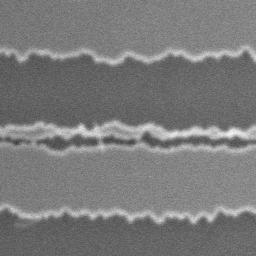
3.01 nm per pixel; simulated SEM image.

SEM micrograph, lines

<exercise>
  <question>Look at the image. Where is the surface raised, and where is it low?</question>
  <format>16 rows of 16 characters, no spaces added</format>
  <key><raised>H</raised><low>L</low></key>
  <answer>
HHHHHHHHHHHHHHHH
HHHHHHHHHHHHHHHH
HHHHHHHHHHHHHHHH
LHLHLLHHHHLHHLLL
LLLLLLLLLLLLLLLL
LLLLLLLLLLLLLLLL
LLLLLLLLLLLLLLLL
LLLLLLLLLLLLLLLL
HHHHHHHHHHHHHHHH
HHHHHHHHHHHHHHHH
HHHHHHHHHHHHHHHH
HHHHHHHHHHHHHHHH
HHHHHHHHHHHHHHHH
LHHLLLLLHHHHHLLL
LLLLLLLLLLLLLLLL
LLLLLLLLLLLLLLLL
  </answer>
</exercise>